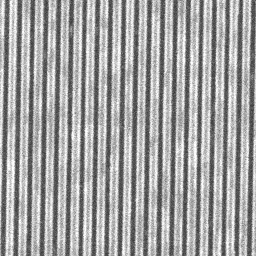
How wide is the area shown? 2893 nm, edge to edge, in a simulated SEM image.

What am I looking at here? parallel lines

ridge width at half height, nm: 80.5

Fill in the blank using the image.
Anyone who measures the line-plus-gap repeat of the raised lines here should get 147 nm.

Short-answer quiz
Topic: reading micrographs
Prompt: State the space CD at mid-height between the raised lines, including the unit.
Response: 72.1 nm